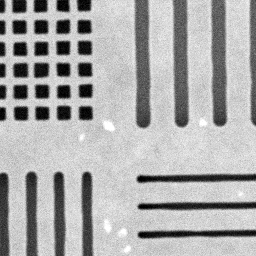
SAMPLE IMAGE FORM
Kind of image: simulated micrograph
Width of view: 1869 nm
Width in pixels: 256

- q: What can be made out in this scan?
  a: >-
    groups of lines, slits or small figures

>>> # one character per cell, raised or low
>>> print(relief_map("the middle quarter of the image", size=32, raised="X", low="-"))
--X----XXXXXXXXXXX----XXXXX----X
--X----XXXXXXXXXXX----XXXXX----X
--XX---XXXXXXXXXXX----XXXXX----X
XXXXXXXXXXXXXXXXXX----XXXXX----X
XXXXXXXXXXXXXXXXXX----XXXXX----X
-XXX---XXXXXXXXXXX----XXXXX----X
--XX---XXXXXXXXXXX----XXXXX----X
--XX---XXXXXXXXXXX----XXXXX----X
--XX---XXXXXXXXXXX----XXXXX----X
XXXXXXXXXXXXXXXXXX----XXXXX----X
-XXX---XXXXXXXXXXX----XXXXX----X
--XX---XXXXXXXXXXX----XXXXX----X
--XX---XXXXXXXXXXX----XXXXXX---X
--XX---XXXXXXXXXXX----XXXXXX---X
XXXXXXXXXXXXXXXXXX----XXXXXX---X
XXXXXXXXXXXXXXXXXX---XXXXXXX---X
XXXXXXXXXXXXXXXXXXXXXXXXXXXXXXXX
XXXXXXXXXXXXXXXXXXXXXXXXXXXXXXXX
XXXXXXXXXXXXXXXXXXXXXXXXXXXXXXXX
XXXXXXXXXXXXXXXXXXXXXXXXXXXXXXXX
XXXXXXXXXXXXXXXXXXXXXXXXXXXXXXXX
XXXXXXXXXXXXXXXXXXXXXXXXXXXXXXXX
XXXXXXXXXXXXXXXXXXXXXXXXXXXXXXXX
XXXXXXXXXXXXXXXXXXXXXXXXXXXXXXXX
XXXXXXXXXXXXXXXXXXXXXXXXXXXXXXXX
XXXXXXXXXXXXXXXXXXXXXXXXXXXXXXXX
XXXXXXXXXXXXXXXXXXXXXXXXXXXXXXXX
XXXXX--XXXXXXXXXXXXXXXXXXXXXXXXX
XXXX---XXXXXXXXXXX--------------
XXXX---XXXXXXXXXXXX-------------
XXXX---XXXXXXXXXXXXXXXXXXXXXXXXX
XXXX---XXXXXXXXXXXXXXXXXXXXXXXXX